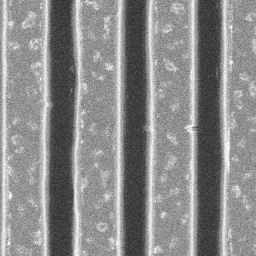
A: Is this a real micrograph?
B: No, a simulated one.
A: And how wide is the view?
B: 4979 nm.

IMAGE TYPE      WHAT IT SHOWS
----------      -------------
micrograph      one or a few lines or trenches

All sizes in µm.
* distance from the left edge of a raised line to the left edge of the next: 1.43